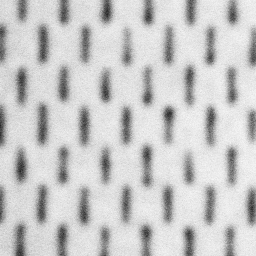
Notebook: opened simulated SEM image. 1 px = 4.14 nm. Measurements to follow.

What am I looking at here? a regular array of holes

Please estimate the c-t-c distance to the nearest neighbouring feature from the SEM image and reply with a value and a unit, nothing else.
174 nanometers